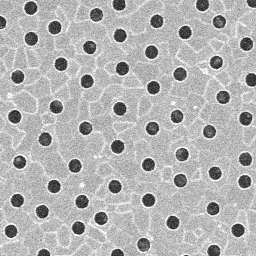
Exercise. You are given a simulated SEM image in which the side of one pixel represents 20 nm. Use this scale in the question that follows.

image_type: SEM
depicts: a regular array of holes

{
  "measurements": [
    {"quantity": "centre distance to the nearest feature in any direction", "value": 620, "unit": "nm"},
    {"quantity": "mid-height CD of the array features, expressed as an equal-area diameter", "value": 0.284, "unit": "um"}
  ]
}